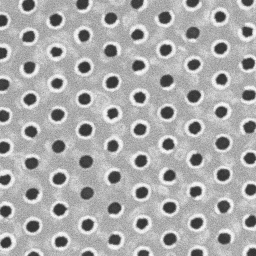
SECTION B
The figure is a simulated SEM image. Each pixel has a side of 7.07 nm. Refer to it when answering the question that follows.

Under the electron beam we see a regular array of holes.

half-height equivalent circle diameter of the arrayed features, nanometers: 88.9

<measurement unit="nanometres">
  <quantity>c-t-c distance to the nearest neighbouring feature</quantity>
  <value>220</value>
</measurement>